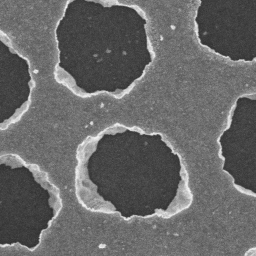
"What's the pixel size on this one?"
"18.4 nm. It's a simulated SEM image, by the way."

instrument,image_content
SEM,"holes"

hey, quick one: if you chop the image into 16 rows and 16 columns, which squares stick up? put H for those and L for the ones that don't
HHHHLLLLHHHHLLLL
HHHHLLLLLHHHLLLL
HHHHLLLLLHHHHLLL
LHHHLLLLLHHHHHLL
LLHHLLLLLHHHHHHH
LLHHHLLLHHHHHHHH
LLHHHHHHHHHHHHHL
LHHHHHHHHHHHHHLL
HHHHHHLLLLHHHHLL
HHHHHHLLLLLHHHLL
LLHHHLLLLLLHHHLL
LLLHHLLLLLLHHHHL
LLLHHHLLLLLHHHHH
LLLHHHHHLHHHHHHH
LLLHHHHHHHHHHHHH
HHHHHHHHHHHHHHHH